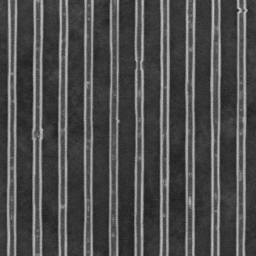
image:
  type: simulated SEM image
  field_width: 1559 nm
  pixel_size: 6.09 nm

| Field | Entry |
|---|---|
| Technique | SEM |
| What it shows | parallel lines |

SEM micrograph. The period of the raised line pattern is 0.155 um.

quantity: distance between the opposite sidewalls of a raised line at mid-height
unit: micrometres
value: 0.0411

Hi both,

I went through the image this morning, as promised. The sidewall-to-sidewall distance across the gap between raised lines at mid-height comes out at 111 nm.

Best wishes